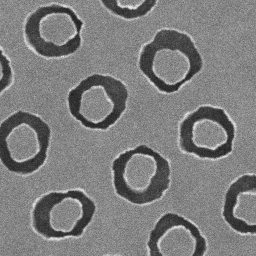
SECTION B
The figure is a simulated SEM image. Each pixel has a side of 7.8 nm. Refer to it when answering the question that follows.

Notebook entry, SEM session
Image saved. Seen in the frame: ring-shaped grooves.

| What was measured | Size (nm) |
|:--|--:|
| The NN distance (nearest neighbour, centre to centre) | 637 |